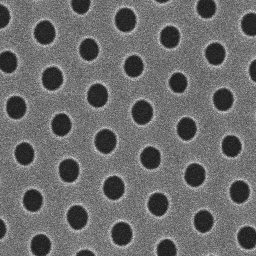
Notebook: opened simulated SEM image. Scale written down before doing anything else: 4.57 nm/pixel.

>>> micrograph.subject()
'a regular array of holes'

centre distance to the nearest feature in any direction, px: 46.5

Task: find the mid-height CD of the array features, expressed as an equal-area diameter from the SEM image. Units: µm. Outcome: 0.103